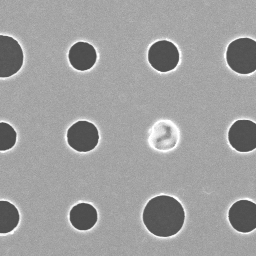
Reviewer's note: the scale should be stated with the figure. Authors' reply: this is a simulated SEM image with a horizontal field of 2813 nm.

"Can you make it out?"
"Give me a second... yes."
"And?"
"holes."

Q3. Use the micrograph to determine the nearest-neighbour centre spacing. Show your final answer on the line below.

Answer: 883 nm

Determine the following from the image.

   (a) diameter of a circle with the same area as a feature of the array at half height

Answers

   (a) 346 nanometres